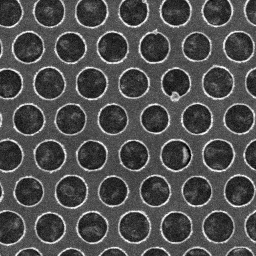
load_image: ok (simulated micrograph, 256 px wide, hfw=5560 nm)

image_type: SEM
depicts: a regular array of holes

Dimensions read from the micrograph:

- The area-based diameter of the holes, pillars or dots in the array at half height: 0.649 um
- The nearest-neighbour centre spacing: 902 nanometres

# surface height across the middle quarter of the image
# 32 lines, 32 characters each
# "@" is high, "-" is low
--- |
@@@@@@@@@@@@@@@@@@@@@@@@@@@@@@@@
@@@@@----@@@@@@@---@@@@@@@----@@
@@@@------@@@@@-----@@@@@------@
@@@-------@@@@-------@@@@------@
@@@--------@@@-------@@@--------
@@@--------@@@-------@@@@------@
@@@-------@@@@-------@@@@------@
@@@@------@@@@@-----@@@@@@-@--@@
@@@@@@--@@@@@@@@@-@@@@@@@@@@@@@@
@@@@@@@@@@@@@@@@@@@@@@@@@@@@@@@@
----@@@@@@@---@@@@@@@---@@@@@@@-
-----@@@@------@@@@@-----@@@@@--
-----@@@@-------@@@-------@@@@--
------@@@-------@@@-------@@@---
-----@@@@-------@@@-------@@@@--
-----@@@@------@@@@@------@@@@--
----@@@@@@-----@@@@@@----@@@@@@-
---@@@@@@@@@-@@@@@@@@@@@@@@@@@@@
@@@@@@@@@@@@@@@@@@@@@@@@@@@@@@@@
@@@@@---@@@@@@@@---@@@@@@@----@@
@@@@------@@@@@-----@@@@@------@
@@@@-------@@@-------@@@@-------
@@@--------@@@-------@@@------@-
@@@--------@@@-------@@@--------
@@@@------@@@@-------@@@@------@
@@@@-----@@@@@@-----@@@@@------@
@@@@@@--@@@@@@@@@-@@@@@@@@@--@@@
@@@@@@@@@@@@@@@@@@@@@@@@@@@@@@@@
----@@@@@@@---@@@@@@@----@@@@@@@
-----@@@@@-----@@@@@------@@@@--
-----@@@@-------@@@-------@@@@--
------@@@-------@@@--------@@@--